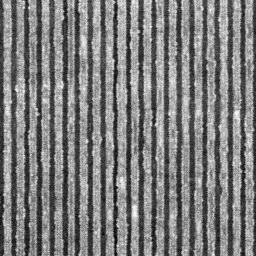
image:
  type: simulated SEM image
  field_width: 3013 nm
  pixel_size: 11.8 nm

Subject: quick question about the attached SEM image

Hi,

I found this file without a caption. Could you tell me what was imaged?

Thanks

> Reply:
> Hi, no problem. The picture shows parallel lines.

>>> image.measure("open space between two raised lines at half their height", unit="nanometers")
66.2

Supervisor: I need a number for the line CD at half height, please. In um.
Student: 0.0765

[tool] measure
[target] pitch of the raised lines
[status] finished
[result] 150 nm